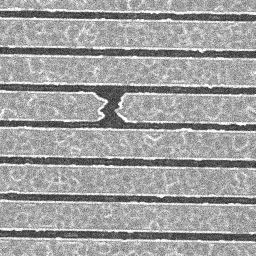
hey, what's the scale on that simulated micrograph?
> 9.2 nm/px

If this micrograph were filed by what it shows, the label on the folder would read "parallel lines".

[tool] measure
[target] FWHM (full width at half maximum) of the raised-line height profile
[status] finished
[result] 29.4 pixels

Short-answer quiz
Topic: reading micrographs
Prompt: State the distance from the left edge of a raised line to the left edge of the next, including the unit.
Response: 335 nm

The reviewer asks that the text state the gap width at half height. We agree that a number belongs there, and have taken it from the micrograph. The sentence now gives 64.4 nm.